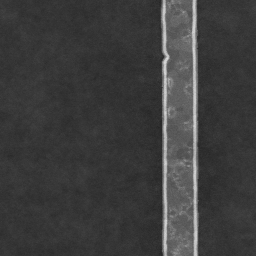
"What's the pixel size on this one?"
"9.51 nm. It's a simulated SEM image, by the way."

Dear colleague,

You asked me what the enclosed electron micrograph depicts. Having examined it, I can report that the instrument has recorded one or a few lines or trenches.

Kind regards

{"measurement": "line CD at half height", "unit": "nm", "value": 285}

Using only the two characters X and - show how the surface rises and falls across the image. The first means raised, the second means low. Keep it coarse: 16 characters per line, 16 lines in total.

----------XX----
----------XX----
----------XX----
----------XX----
----------XX----
----------XX----
----------XX----
----------XX----
----------XX----
----------XX----
----------XX----
----------XX----
----------XX----
----------XX----
----------XX----
----------XX----